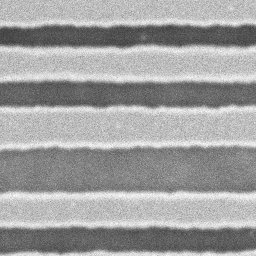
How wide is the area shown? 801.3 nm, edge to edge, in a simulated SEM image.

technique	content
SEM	lines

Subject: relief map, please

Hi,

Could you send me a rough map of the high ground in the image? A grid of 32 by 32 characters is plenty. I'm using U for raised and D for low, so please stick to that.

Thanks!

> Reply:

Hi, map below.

UUUUUUUUUUUUUUUUUUUUUUUUUUUUUUUU
UUUUUUUUUUUUUUUUUUUUUUUUUUUUUUUU
UUUUUUUUUUUUUUUUUUUUUUUUUUUUUUUU
DDDDDDDDDDDDDDDDDDDDDDDDDDDDDDDD
DDDDDDDDDDDDDDDDDDDDDDDDDDDDDDDD
DDDDDDDDDDDDDDDDDDDDDDDDDDDDDDDD
UUUUUUUUUUUUUUUUUUUUUUUUUUUUUUUU
UUUUUUUUUUUUUUUUUUUUUUUUUUUUUUUU
UUUUUUUUUUUUUUUUUUUUUUUUUUUUUUUU
UUUUUUUUUUUUUUUUUUUUUUUUUUUUUUUU
DDDDDDDDDDDDDDDDDDDDDDDDDDDDDDDD
DDDDDDDDDDDDDDDDDDDDDDDDDDDDDDDD
DDDDDDDDDDDDDDDDDDDDDDDDDDDDDDDD
UUUUUUUUUUUUDUUUUUUDUUUUUUDUUUUU
UUUUUUUUUUUUUUUUUUUUUUUUUUUUUUUU
UUUUUUUUUUUUUUUUUUUUUUUUUUUUUUUU
UUUUUUUUUUUUUUUUUUUUUUUUUUUUUUUU
UUUUUUUUUUUUUUUUUUUUUUUUUUUUUUUU
UUUUDDDDDDDDDUDDDDDDDDDDDDDDDDDD
DDDDDDDDDDDDDDDDDDDDDDDDDDDDDDDD
DDDDDDDDDDDDDDDDDDDDDDDDDDDDDDDD
DDDDDDDDDDDDDDDDDDDDDDDDDDDDDDDD
DDDDDDDDDDDDDDDDDDDDDDDDDDDDDDDD
DDDDDDDDDDDDDDDDDDDDDDDDDDDDDDDD
UUUUUUUUUUUUUUUUUUUUUUUUUUUUUUUU
UUUUUUUUUUUUUUUUUUUUUUUUUUUUUUUU
UUUUUUUUUUUUUUUUUUUUUUUUUUUUUUUU
UUUUUUUUUUUUUUUUUUUUUUUUUUUUUUUU
DDDUUUDDDDDUDDDUUUDDDDUUUUUUDUDU
DDDDDDDDDDDDDDDDDDDDDDDDDDDDDDDD
DDDDDDDDDDDDDDDDDDDDDDDDDDDDDDDD
DDDDUDDDDDDUUUDDUUUDDUDUDDDDDDUU